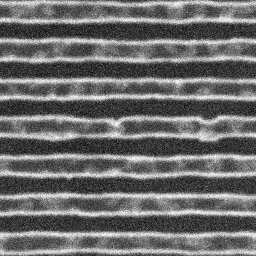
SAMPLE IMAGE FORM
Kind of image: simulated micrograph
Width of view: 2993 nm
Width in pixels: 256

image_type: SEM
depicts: parallel lines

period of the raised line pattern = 451 nanometres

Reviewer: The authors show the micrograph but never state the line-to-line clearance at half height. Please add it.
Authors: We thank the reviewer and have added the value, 0.244 micrometres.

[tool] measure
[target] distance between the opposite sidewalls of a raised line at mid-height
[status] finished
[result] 209 nm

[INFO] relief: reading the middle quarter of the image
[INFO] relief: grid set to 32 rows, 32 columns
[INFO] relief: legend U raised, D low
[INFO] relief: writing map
DDDDDDDDDDDDDDDDDDDDDDDDDDDDDDDD
DDDDDDDDDDDDDDDDDDDDDDDDDDDDDDDD
DDDDDDDDDDDDDDDDDDDDDDDDDDDDDDDD
DDDDDDDDDDDDDDDDDDDDDDDDDDDDDDDD
UUUUUUUUUUUUUUUUUUUUUUUUUUUUUUUU
UUUUUUUUUUUUUUUUUUUUUUUUUUUUUUUU
UUUUUUUUUUUUUUUUUUUUUUUUUUUUUUUU
UUUUUUUUUUUUUUUUUUUUUUUUUUUUUUUU
UUUDDDDDDDDDDDDDDDDDDDDDDDDDDDDD
DDDDDDDDDDDDDDDDDDDDDDDDDDDDDDDD
DDDDDDDDDDDDDDDDDDDDDDDDDDDDDDDD
DDDDDDDDDDDDDDDDDDDDDDDDDDDDDDDD
DDDDDDDDDDDDDDDDDDDDDDDDDDDDDDDD
DDDDDDDDDDDDDDDDDDUUUDDDDDDDDDDD
UUUUUUUUUUUUDDUUUUUUUUUUUUUUUUUU
UUUUUUUUUUUUUUUUUUUUUUUUUUUUUUUU
UUUUUUUUUUUUUUUUUUUUUUUUUUUUUUUU
UUUUUUUUUUUUUUUUUUUUUUUUUUUUUUUU
DDDDDDDDDDDDDDDDDDDDDDDDDDDDDDDD
DDDDDDDDDDDDDDDDDDDDDDDDDDDDDDDD
DDDDDDDDDDDDDDDDDDDDDDDDDDDDDDDD
DDDDDDDDDDDDDDDDDDDDDDDDDDDDDDDD
DDDDDDDDDDDDDDDDDDDDDDDDDDDDDDDD
UUUUUUUUUUUUUUUUDDDDDDDDDDDDUUUU
UUUUUUUUUUUUUUUUUUUUUUUUUUUUUUUU
UUUUUUUUUUUUUUUUUUUUUUUUUUUUUUUU
UUUUUUUUUUUUUUUUUUUUUUUUUUUUUUUU
UUUUUUUUUUUUUUUUUUUUUUUUUUUUUDDD
DDDDDDDDDDDDDDDDDDDDDDDDDDDDDDDD
DDDDDDDDDDDDDDDDDDDDDDDDDDDDDDDD
DDDDDDDDDDDDDDDDDDDDDDDDDDDDDDDD
DDDDDDDDDDDDDDDDDDDDDDDDDDDDDDDD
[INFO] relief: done